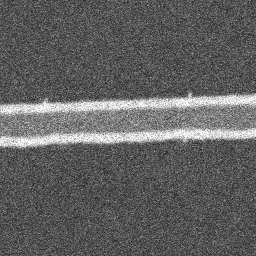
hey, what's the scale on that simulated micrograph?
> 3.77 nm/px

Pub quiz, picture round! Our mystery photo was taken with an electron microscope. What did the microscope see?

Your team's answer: one or a few lines or trenches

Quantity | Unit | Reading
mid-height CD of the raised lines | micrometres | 0.131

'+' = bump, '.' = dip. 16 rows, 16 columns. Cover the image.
................
................
................
................
................
................
........++++++++
++++++++++++++++
++++++++++......
................
................
................
................
................
................
................